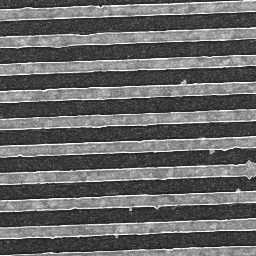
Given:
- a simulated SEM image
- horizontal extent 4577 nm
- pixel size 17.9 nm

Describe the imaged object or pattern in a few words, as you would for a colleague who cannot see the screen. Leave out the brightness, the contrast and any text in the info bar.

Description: parallel lines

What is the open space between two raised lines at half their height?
295 nm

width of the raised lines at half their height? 201 nanometres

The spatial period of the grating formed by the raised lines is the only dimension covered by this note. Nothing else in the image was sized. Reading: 488 nanometers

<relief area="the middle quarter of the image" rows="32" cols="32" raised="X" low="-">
XXXXXXXXXXXXXXXXXXXXXXXXXXXXXXXX
XXXXXXXXXXXXXXXXX---------------
--------------------------------
--------------------------------
--------------------------------
---------------------X----XXXXXX
XXXXXXXXXXXXXXXXXXXXXXXXXXXXXXXX
XXXXXXXXXXXXXXXXXXXXXXXXXXXXXXXX
XXXXXXXXXXXXXXX-----------------
--------------------------------
--------------------------------
--------------------------------
-------------------XXXXXXXXXXXXX
XXXXXXXXXXXXXXXXXXXXXXXXXXXXXXXX
XXXXXXXXXXXXXXXXXXXXXXXXXXXXXXXX
XXXXXXXXXX----------------------
--------------------------------
--------------------------------
--------------------------------
-------------XXXXXXXXXXXXXXXXXXX
XXXXXXXXXXXXXXXXXXXXXXXXXXXXXXXX
XXXXXXXXXXXXXXXXXXXXXXXXXXXX----
XX-XXX--------------------------
--------------------------------
--------------------------------
--------------------------------
----------XXXXXXXXXXXXXXXXXXXXXX
XXXXXXXXXXXXXXXXXXXXXXXXXXXXXXXX
XXXXXXXXXXXXXXXXXXXXXXXXXX------
--------------------------------
--------------------------------
--------------------------------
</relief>